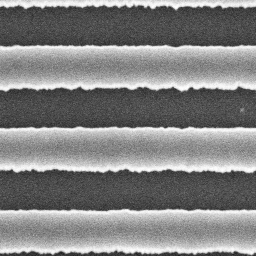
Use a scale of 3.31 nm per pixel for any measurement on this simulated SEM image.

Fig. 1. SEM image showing lines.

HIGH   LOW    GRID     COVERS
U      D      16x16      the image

DDDDDDDDDDDDDDDD
DDDDDDDDDDDDDDDD
DDDDDDDDDDDDDDDD
UUUUUUUUUUUUUUUU
UUUUUUUUUUUUUUUU
UUUDUUDDDUDUUUUU
DDDDDDDDDDDDDDDD
DDDDDDDDDDDDDDDD
UUUUUUUUUUUUUUUU
UUUUUUUUUUUUUUUU
UUUUUUUUUUUUUUUU
DDDDDDDDDDDDDDDD
DDDDDDDDDDDDDDDD
UUUUUUUUUUUUUUUU
UUUUUUUUUUUUUUUU
UUUUUUUUUUUUUUUU